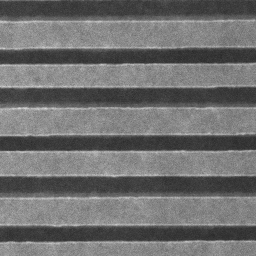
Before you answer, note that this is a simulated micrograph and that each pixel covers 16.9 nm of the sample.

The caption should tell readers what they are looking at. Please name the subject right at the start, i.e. lines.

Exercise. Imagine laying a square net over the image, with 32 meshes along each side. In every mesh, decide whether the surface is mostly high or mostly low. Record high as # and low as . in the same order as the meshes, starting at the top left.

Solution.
................................
................................
................................
################################
################################
################################
................................
................................
################################
################################
################################
................................
................................
################################
################################
################################
################################
................................
................................
################################
################################
################################
................................
................................
................................
################################
################################
################################
................................
................................
################################
################################